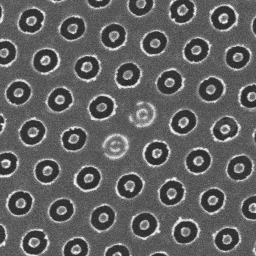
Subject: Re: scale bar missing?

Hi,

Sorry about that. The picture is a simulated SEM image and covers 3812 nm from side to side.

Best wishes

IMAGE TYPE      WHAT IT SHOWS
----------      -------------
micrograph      a regular array of ring-shaped grooves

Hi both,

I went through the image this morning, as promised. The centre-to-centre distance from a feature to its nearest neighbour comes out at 620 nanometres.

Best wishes